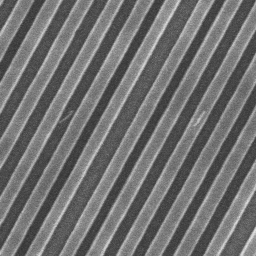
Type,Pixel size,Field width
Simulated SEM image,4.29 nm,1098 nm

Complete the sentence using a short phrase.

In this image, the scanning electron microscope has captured parallel lines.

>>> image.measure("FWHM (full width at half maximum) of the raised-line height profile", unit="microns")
0.055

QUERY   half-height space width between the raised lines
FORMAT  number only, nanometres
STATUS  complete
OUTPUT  54.6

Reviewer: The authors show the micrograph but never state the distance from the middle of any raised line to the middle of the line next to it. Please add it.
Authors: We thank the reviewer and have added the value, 0.111 microns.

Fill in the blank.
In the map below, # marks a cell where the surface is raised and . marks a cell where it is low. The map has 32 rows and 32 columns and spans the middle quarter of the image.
..####....###....###.....####...
..###....####...###.....####...#
.###.....###...####.....###....#
####....###....###.....####...##
####...####...####.....###....##
###....###....###.....####...###
###...####...####.....###...####
##....####..####.....####...####
#....####...###......###...####.
#....###....###.....###....###..
....####...###.....####...####..
....###....###.....###....###...
...####...###.....####...####...
..####...####.....###....###....
..####...###.....####...####....
.####...####.....###...####....#
.###....###.....####...####...##
####...####.....###...####....##
####..####.....####...####...###
###...###......###...####....###
##....###.....####...####...####
##...###.....####...####....###.
#....###.....###....###....####.
#...###.....####...####....###..
...####.....###...####....####..
...###.....####...####....###...
..####.....###...####....####...
..###.....####...####...####....
.###......###...####....###....#
.###.....####...####...####....#
###......###...####....###....##
###.....####...####...####....##